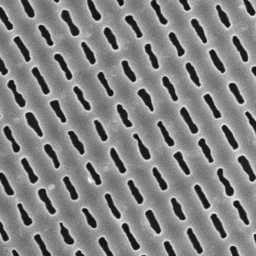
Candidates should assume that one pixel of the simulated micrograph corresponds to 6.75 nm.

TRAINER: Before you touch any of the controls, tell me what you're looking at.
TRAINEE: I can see a regular array of holes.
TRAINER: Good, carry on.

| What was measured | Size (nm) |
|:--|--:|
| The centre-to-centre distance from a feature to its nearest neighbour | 182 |